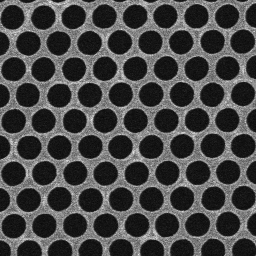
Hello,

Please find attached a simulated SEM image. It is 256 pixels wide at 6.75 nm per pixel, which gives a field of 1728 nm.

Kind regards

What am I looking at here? a regular array of holes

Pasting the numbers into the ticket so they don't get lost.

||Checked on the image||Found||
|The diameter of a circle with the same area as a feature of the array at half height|164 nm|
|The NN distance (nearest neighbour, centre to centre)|202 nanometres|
